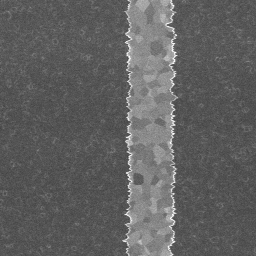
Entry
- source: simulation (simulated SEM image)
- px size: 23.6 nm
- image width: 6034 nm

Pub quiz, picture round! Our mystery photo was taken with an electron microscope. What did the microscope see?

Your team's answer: one or a few lines or trenches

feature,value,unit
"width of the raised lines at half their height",1050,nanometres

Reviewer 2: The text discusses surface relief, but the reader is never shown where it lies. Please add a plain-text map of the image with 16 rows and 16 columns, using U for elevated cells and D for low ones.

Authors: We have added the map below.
DDDDDDDDUUUDDDDD
DDDDDDDDUUUDDDDD
DDDDDDDDUUUDDDDD
DDDDDDDDUUUDDDDD
DDDDDDDDUUUDDDDD
DDDDDDDDUUUDDDDD
DDDDDDDDUUUDDDDD
DDDDDDDDUUUDDDDD
DDDDDDDDUUUDDDDD
DDDDDDDDUUUDDDDD
DDDDDDDDUUUDDDDD
DDDDDDDDUUUDDDDD
DDDDDDDDUUUDDDDD
DDDDDDDDUUUDDDDD
DDDDDDDDUUUDDDDD
DDDDDDDDUUUDDDDD